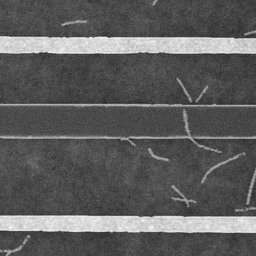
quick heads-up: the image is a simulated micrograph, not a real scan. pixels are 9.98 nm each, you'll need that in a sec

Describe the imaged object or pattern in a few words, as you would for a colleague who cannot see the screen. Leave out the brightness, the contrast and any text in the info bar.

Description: lines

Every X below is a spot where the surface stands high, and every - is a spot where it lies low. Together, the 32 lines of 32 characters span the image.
--------------------------------
--------------------------------
--------------------------------
--------------------------------
--------------------------------
XXXXXXXXXXXXXXXXXXXXXXXXXXXXXXXX
XXXXX-XXXXXXXXXXXXXXXXXXXXXXXXXX
--------------------------------
--------------------------------
--------------------------------
--------------------------------
--------------------------------
--------------------------------
XXXXXXXXXXXXXXXXXXXXXXXXXXXXXXXX
XXXXXXXXXXXXXXXXXXXXXXXXXXXXXXXX
XXXXXXXXXXXXXXXXXXXXXXXXXXXXXXXX
XXXXXXXXXXXXXXXXXXXXXXXXXXXXXXXX
--------------------------------
--------------------------------
--------------------------------
--------------------------------
--------------------------------
--------------------------------
--------------------------------
--------------------------------
--------------------------------
--------------------------------
XXXXXXXXXXXXXXXXXXXXXXXXXXXXXXXX
XXXXXXXXXXXXXXXXXXXXXXXXXXXXXXXX
--------------------------------
--------------------------------
--------------------------------